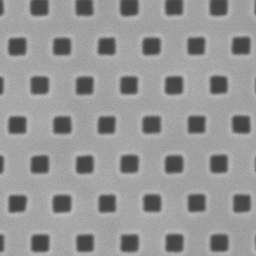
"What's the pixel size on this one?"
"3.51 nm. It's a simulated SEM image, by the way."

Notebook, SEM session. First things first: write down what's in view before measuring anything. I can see a regular array of holes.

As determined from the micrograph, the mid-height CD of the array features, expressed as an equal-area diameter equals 73.1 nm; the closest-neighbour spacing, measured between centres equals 0.157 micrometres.